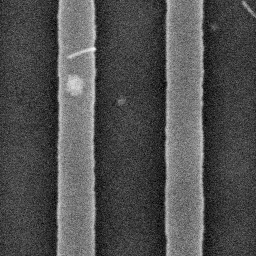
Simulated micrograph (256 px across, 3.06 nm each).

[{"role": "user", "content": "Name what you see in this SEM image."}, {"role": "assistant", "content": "lines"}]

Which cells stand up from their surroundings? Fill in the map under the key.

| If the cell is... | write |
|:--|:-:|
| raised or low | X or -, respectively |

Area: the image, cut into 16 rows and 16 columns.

----XX----XXX---
----XX----XXX---
----XX----XXX---
----XX----XXX---
----XX----XXX---
----XX----XXX---
----XX----XXX---
----XX----XXX---
----XX----XXX---
----XX----XXX---
----XX----XXX---
----XX----XXX---
----XX----XXX---
----XX----XXX---
----XX----XXX---
----XX----XXX---